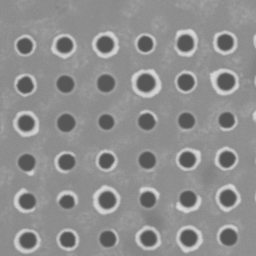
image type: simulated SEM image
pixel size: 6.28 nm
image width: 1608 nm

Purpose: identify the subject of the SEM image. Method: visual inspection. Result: a regular array of holes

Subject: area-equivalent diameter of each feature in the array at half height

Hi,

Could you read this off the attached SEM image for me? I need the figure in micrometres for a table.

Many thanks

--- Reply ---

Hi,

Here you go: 0.102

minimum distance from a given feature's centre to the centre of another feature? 38.9 pixels